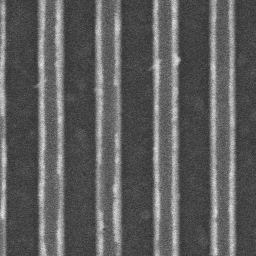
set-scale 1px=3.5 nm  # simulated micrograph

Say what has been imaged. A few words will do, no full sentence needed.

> parallel lines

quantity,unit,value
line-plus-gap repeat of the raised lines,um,0.201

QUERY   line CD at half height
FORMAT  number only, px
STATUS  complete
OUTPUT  22.5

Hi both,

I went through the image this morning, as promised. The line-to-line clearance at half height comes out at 121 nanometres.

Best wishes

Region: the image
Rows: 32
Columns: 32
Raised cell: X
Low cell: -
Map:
X----XXX----XXX----XXX-----XX---
X----XXX----XXX----XXX-----XX---
X----XXX----XXX----XXX-----XX---
X----XXX----XXX----XXX-----XX---
X----XXX----XXX----XXX-----XX---
X----XXX----XXX----XXX----XXX---
-----XXX----XXX----XXX----XXX---
-----XXX----XXX----XXX----XXX---
-----XXX----XXX----XXX----XXX---
-----XXX----XXX----XXX-----XX---
-----XXX----XXX----XXX-----XX---
-----XXX----XXX----XXX-----XX---
-----XXX----XXX----XXX-----XX---
-----XXX----XXX----XXX-----XX---
-----XXX----XXX----XXX-----XX---
-----XXX----XXX----XXX-----XX---
-----XXX----XXX----XXX-----XX---
X----XXX----XXX----XXX-----XX---
X----XXX----XXX----XXX-----XX---
X----XXX----XXX----XXX-----XX---
X----XXX----XXX----XXX-----XX---
X----XXX----XXX----XXX-----XX---
X----XXX----XXX----XXX-----XX---
X----XXX----XXX----XXX-----XX---
X----XXX----XXX----XXX-----XX---
X----XXX----XXX----XXX-----XX---
X----XXX----XXX----XXX-----XX---
X----XXX----XXX----XXX-----XX---
X----XXX----XXX----XXX-----XX---
X----XXX----XXX----XXX-----XX---
X----XXX----XXX----XXX-----XX---
X----XXX----XXX----XXX-----XX---